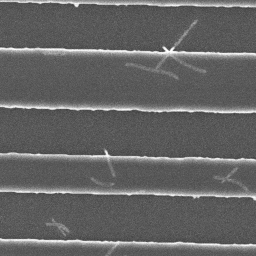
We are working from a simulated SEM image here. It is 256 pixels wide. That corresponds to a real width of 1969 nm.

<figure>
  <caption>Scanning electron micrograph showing lines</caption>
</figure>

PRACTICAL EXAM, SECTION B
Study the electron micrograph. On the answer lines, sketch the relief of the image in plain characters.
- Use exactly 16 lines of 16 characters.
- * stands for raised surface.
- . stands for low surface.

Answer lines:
................
................
................
****************
****************
****************
****************
................
................
................
****************
****************
................
................
................
****************